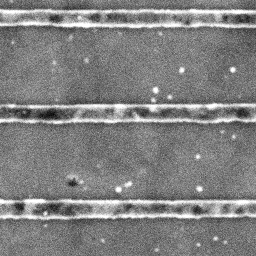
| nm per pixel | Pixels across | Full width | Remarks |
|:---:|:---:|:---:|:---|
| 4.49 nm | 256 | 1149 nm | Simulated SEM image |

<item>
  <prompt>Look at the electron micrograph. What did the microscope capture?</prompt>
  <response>lines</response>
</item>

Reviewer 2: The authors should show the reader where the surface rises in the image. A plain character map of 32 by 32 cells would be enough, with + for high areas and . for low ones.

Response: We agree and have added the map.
................................
+++++++++++++++++++++.++++++++.+
++++++++++++++++++++++++++++++++
................................
................................
................................
................................
................................
................................
................................
................................
................................
................................
++++++++++++++++++++++++++++++++
++++++++++++++++++++++++++++++++
................................
................................
................................
................................
................................
................................
................................
................................
................................
................................
++++++++++++++++++++++++++++++++
++++++++++++++++++++++++++++++++
................................
................................
................................
................................
................................